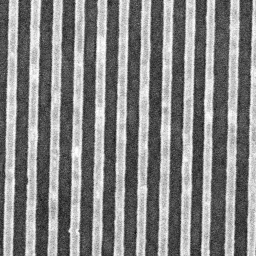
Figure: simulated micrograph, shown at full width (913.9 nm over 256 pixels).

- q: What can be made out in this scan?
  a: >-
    parallel lines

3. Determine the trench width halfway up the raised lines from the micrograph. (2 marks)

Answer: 50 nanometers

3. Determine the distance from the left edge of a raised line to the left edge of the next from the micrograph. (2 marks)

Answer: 22.1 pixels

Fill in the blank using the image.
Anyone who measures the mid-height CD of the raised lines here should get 7.87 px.